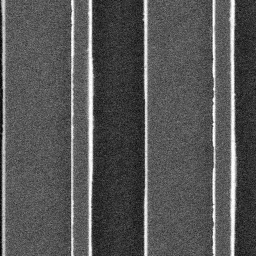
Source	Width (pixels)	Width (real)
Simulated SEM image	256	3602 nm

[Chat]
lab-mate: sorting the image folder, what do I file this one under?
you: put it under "lines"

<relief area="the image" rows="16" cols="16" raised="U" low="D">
UUUUUUDDDUUUUUUD
UUUUUUDDDUUUUUDD
UUUUUUDDDUUUUUDD
UUUUUUDDDUUUUUDD
UUUUUUDDDUUUUUUD
UUUUUUDDDUUUUUUD
UUUUUUDDDUUUUUDD
UUUUUUDDDUUUUUDD
UUUUUUDDDUUUUUDD
UUUUUUDDDUUUUUDD
UUUUUUDDDUUUUUDD
UUUUUUDDDUUUUUDD
UUUUUUDDDUUUUUDD
UUUUUUDDDUUUUUDD
UUUUUUDDDUUUUUDD
UUUUUUDDDUUUUUDD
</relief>